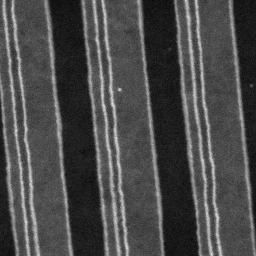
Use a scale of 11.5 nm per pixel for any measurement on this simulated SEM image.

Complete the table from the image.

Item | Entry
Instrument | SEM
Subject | lines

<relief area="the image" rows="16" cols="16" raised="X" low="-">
XXX--XXXX--XXX--
XXX--XXXX--XXXX-
XXX--XXXX--XXXX-
XXX--XXXX--XXXX-
XXX---XXX--XXXX-
XXX---XXX--XXXX-
XXXX--XXX---XXX-
XXXX--XXX---XXX-
XXXX--XXX---XXX-
XXXX--XXXX--XXX-
-XXX--XXXX--XXX-
-XXX--XXXX--XXX-
-XXX--XXXX--XXXX
-XXX---XXX--XXXX
-XXX---XXX--XXXX
-XXX---XXX--XXXX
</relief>